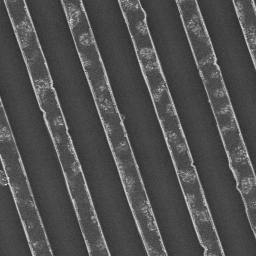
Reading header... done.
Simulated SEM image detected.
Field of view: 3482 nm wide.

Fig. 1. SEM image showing parallel lines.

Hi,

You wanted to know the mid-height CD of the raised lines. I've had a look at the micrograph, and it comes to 255 nm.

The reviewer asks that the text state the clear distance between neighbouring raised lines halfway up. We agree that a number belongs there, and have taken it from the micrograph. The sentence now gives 486 nm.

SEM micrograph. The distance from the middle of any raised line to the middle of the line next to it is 54.1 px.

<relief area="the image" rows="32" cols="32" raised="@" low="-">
-@@-----@@-----@@@----@@@----@@@
-@@-----@@@----@@@----@@@-----@@
-@@@----@@@-----@@-----@@-----@@
--@@-----@@-----@@-----@@@----@@
--@@@----@@@----@@@----@@@-----@
--@@@----@@@-----@@-----@@-----@
---@@-----@@-----@@-----@@@----@
---@@@----@@@----@@@----@@@-----
---@@@----@@@-----@@-----@@-----
----@@-----@@-----@@-----@@@----
----@@-----@@@----@@@-----@@----
----@@@-----@@-----@@-----@@----
-----@@-----@@-----@@-----@@@---
-----@@-----@@@----@@@-----@@---
@-----@@----@@@-----@@-----@@---
@-----@@-----@@-----@@-----@@@--
@-----@@-----@@@----@@@-----@@--
@@-----@@-----@@-----@@-----@@--
@@-----@@-----@@-----@@-----@@@-
@@-----@@@----@@@----@@@-----@@-
@@@-----@@-----@@-----@@-----@@-
-@@-----@@-----@@-----@@-----@@@
-@@-----@@@----@@@----@@@-----@@
-@@@-----@@----@@@-----@@-----@@
--@@-----@@-----@@-----@@-----@@
--@@-----@@@----@@@----@@@-----@
--@@@-----@@-----@@-----@@-----@
---@@-----@@-----@@-----@@@----@
---@@-----@@@----@@@----@@@----@
---@@@----@@@-----@@-----@@-----
----@@-----@@-----@@-----@@@----
----@@-----@@@----@@@-----@@----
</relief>